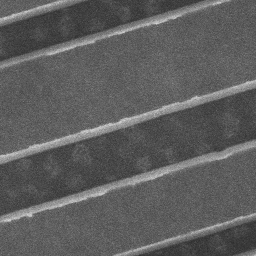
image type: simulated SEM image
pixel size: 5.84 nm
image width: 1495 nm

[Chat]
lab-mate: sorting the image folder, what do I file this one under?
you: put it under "one or a few lines or trenches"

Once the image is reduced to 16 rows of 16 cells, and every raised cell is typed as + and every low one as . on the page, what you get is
+++.........++++
........++++++++
.....+++++++++++
..++++++++++++++
++++++++++++++++
+++++++++++++++.
++++++++++++....
+++++++++.......
+++++...........
++............++
...........+++++
.......+++++++++
....++++++++++++
.+++++++++++++++
+++++++++++++...
++++++++++......